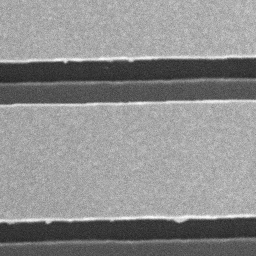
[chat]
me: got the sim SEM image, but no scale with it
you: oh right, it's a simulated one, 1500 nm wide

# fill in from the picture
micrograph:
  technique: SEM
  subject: lines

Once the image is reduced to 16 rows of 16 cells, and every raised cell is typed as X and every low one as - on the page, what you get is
XXXXXXXXXXXXXXXX
XXXXXXXXXXXXXXXX
XXXXXXXXXXXXXXXX
XXXXXXXXXXXXXXXX
----------------
----------------
-----XXXXXXXXXXX
XXXXXXXXXXXXXXXX
XXXXXXXXXXXXXXXX
XXXXXXXXXXXXXXXX
XXXXXXXXXXXXXXXX
XXXXXXXXXXXXXXXX
XXXXXXXXXXXXXXXX
XXXXXXXXXXXXXXXX
----------------
----------------